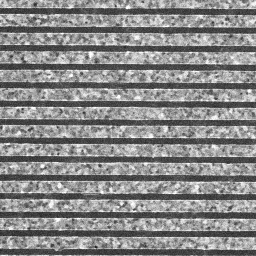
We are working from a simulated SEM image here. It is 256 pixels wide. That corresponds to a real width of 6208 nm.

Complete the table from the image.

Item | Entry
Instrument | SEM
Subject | parallel lines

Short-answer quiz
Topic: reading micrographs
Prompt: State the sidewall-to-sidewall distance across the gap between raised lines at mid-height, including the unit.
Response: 170 nanometers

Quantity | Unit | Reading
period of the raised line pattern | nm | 449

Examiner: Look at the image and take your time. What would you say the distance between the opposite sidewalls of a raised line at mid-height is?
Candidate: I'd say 282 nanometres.